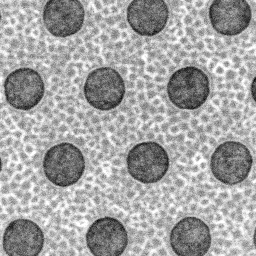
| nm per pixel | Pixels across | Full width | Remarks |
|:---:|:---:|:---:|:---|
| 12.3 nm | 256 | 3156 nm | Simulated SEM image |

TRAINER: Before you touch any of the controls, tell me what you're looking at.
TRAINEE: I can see holes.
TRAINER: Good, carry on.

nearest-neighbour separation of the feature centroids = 1.03 micrometres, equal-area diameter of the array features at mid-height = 537 nm